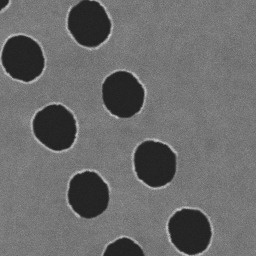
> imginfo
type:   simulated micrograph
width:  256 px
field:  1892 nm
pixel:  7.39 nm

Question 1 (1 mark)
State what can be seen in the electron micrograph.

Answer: holes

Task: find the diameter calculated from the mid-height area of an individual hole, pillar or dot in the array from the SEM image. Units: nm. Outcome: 328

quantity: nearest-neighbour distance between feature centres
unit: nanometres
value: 555